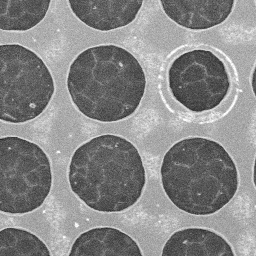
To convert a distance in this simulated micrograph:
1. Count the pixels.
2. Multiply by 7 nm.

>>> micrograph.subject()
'holes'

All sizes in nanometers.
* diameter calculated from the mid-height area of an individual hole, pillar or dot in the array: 540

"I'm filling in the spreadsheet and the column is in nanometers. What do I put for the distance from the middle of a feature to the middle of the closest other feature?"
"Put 637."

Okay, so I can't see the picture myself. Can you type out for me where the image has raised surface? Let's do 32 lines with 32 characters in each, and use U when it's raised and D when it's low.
DDDDDDUUUDDDDDDDDDUUDDDDDDDDDUUU
DDDDDDUUUDDDDDDDDUUUUDDDDDDDDUUU
DDDDDUUUUUDDDDDDDUUUUUDDDDDDUUUU
DDDDUUUUUUUUDDDUUUUUUUUDDDUUUUUU
UUUUUUUUUUUUUUUUUUUUUUUUUUUUUUUU
UDUUUUUUUUUUUUUUUUUUUUUUUUUUUUUU
DDDDUUUUUUDDDDDDUUUUUUUDDDUUUUUU
DDDDDUUUUDDDDDDDDUUUUUDDDDDDUUUU
DDDDDDUUUDDDDDDDDDUUUDDDDDDDUUUU
DDDDDDUUUDDDDDDDDDUUUDDDDDDDDUUD
DDDDDDDUDDDDDDDDDDUUUDDDDDDDDUUD
DDDDDDDUUDDDDDDDDDUUUDDDDDDDDUUU
DDDDDDUUUDDDDDDDDDUUUUDDDDDDUUUU
DDDDDDUUUUDDDDDDDUUUUUUDDDDUUUUU
DDDDDUUUUUUDDDDDUUUUUUUUUUUUUUUU
UUUUUUUUUUUUUUUUUUUUUUUUUUUUUUUU
UUUUUUUUUUUUUUUUUUUUUUUUUUUUUUUU
DDDUUUUUUUUDDDDDUUUUUUUDDDUUUUUU
DDDDDUUUUUDDDDDDDUUUUDDDDDDDUUUU
DDDDDDUUUDDDDDDDDDUUUDDDDDDDDUUU
DDDDDDUUUDDDDDDDDDUUDDDDDDDDDUUU
DDDDDDUUUDDDDDDDDDUUDDDDDDDDDDUU
DDDDDDDUUDDDDDDDDDUUDDDDDDDDDDUU
DDDDDDUUUDDDDDDDDDUUDDDDDDDDDDUU
DDDDDDUUUUDDDDDDDDUUUDDDDDDDDUUU
DDDDDUUUUUUDDDDDDUUUUUDDDDDDUUUU
UDDDUUUUUUUUUDDUUUUUUUUDDDDUUUUU
UUUUUUUUUUUUUUUUUUUUUUUUUUUUUUUU
UUUUUUUUUUUUDDUUUUUUUUUUUUUUUUUU
DDDDDUUUUUDDDDDDUUUUUDDDDDDDUUUU
DDDDDDUUUDDDDDDDDUUUUDDDDDDDDUUU
DDDDDDUUUDDDDDDDDDUUDDDDDDDDDUUU